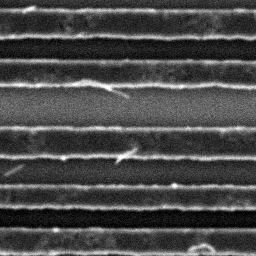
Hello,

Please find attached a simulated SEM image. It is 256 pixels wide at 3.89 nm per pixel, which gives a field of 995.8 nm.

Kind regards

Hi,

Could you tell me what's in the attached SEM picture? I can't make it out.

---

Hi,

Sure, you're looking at lines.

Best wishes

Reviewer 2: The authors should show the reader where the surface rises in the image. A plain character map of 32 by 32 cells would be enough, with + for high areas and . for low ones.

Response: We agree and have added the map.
................................
++++++++++++++++++++++++++++++++
++++++++++++++++++++++++++++++++
++++++++++++++++++++++++++++++++
++++++++++++++++++++++++++++++++
................................
................................
................................
++++++++++++++++++++++++++++++++
++++++++++++++++++++++++++++++++
++++++++++++++++++++++++++++++++
................................
................................
................................
................................
................................
++++++++++++++++++++++++++++++++
++++++++++++++++++++++++++++++++
++++++++++++++++++++++++++++++++
++++++++++++++++++++++++++++++++
................................
................................
................................
++++++++++++++++++++++++++++++++
++++++++++++++++++++++++++++++++
++++++++++++++++++++++++++++++++
................................
................................
................................
++++++++++++++++++++++++++++++++
++++++++++++++++++++++++++++++++
++++++++++++++++++++++++++++++++